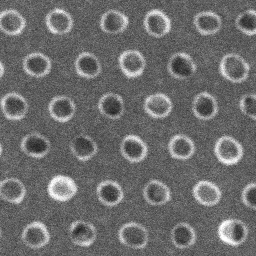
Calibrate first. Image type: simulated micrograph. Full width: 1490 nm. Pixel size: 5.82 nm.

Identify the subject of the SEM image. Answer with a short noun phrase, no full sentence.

a regular array of raised bodies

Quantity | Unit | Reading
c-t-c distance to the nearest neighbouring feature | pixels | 46.4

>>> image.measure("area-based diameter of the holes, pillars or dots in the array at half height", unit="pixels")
23.4